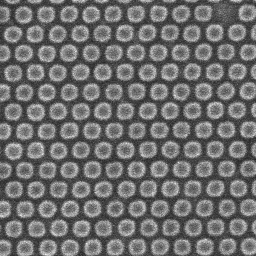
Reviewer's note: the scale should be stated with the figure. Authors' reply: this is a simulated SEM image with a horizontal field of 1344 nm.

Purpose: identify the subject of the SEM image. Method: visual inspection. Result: a regular array of raised bodies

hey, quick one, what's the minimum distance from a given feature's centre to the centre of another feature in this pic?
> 116 nm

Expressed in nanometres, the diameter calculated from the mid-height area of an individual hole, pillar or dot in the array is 83.1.